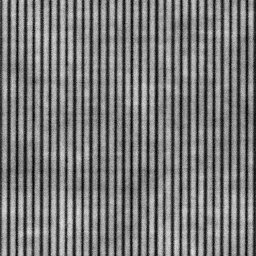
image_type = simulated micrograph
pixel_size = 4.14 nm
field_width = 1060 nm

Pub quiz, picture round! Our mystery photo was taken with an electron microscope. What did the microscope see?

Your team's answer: parallel lines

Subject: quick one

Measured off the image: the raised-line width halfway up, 22.8 nanometers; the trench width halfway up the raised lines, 11.4 nm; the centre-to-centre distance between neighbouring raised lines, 34 nanometres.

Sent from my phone